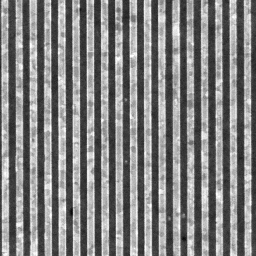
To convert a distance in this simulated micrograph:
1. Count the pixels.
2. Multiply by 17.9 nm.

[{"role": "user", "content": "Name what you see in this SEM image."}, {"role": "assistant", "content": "parallel lines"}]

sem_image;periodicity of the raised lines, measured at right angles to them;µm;0.255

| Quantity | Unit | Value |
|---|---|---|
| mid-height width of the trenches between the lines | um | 0.145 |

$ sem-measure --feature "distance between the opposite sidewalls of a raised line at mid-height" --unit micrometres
0.112